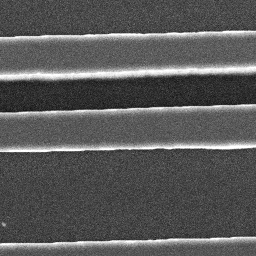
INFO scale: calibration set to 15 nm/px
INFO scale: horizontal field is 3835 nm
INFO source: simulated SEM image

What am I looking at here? lines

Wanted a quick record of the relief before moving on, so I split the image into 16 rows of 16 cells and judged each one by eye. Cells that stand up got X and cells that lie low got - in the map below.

----------------
----------------
XXXXXXXXXXXXXXXX
XXXXXXXXXXXXXXXX
XXXXXXXXX-------
----------------
----------------
XXXXXXXXXXXXXXXX
XXXXXXXXXXXXXXXX
----------------
----------------
----------------
----------------
----------------
----------------
XXXXXXXXXXXXXXXX